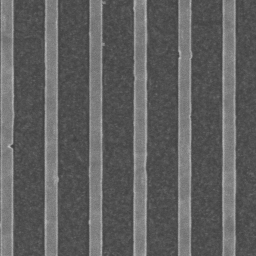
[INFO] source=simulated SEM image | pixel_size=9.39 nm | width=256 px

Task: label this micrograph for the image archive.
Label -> parallel lines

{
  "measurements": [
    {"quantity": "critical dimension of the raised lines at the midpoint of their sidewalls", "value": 0.116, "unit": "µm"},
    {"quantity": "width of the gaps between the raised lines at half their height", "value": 0.305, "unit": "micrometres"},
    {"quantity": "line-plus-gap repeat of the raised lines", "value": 417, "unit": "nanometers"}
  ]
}